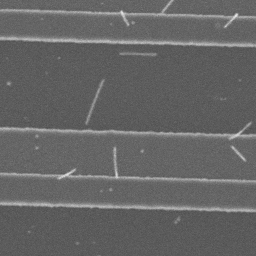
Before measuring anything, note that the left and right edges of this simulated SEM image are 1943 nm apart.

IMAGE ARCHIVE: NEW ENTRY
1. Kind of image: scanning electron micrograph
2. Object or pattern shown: lines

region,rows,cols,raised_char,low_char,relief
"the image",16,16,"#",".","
################
################
...#############
................
................
................
................
................
################
################
################
################
################
................
................
................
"